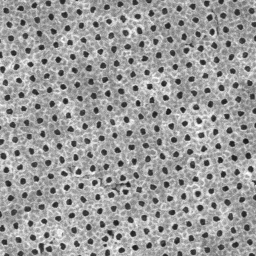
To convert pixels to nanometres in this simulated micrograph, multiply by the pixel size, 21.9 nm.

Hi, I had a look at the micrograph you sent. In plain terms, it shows a regular array of holes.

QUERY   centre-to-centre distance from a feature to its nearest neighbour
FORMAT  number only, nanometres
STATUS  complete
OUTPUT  301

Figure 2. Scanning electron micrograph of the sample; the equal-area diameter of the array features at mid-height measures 144 nm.